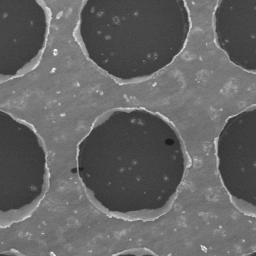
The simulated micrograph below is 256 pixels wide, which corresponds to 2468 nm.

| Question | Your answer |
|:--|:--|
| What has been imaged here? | holes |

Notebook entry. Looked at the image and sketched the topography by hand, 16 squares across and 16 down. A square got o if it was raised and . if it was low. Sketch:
...oo.......oo..
...oo.......o...
...oo.......oo..
..oooo.....ooo..
.oooooo...oooooo
oooooooooooooooo
oooooooooooooooo
.ooooo....oooo..
..ooo......ooo..
...oo.......oo..
...oo.......oo..
...oo......ooo..
..oooo.....oooo.
.ooooooooooooooo
oooooooooooooooo
oooooooooooooooo